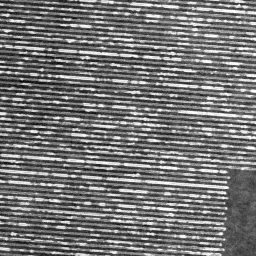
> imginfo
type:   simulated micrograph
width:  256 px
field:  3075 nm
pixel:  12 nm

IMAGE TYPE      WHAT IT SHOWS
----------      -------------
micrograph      parallel lines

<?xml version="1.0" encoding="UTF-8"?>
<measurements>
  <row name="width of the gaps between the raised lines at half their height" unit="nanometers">44.9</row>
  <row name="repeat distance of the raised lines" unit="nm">62.3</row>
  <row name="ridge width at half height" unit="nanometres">22.5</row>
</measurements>